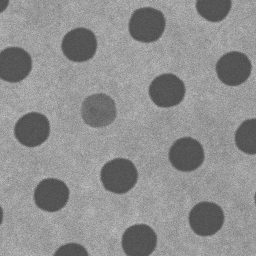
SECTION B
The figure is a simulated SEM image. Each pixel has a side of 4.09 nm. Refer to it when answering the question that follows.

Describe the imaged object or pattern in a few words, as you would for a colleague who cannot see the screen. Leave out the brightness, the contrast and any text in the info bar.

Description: a regular array of holes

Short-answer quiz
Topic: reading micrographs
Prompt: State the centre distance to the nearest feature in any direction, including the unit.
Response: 275 nm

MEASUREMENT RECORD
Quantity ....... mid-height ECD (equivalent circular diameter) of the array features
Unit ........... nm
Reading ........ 144